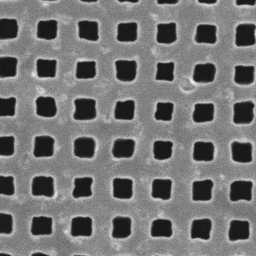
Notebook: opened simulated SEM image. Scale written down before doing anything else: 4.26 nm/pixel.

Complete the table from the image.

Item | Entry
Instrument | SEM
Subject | a regular array of holes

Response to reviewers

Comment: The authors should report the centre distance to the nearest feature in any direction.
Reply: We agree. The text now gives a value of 164 nm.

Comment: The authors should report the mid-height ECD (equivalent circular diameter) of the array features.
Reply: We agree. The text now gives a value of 90.3 nm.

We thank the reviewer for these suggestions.